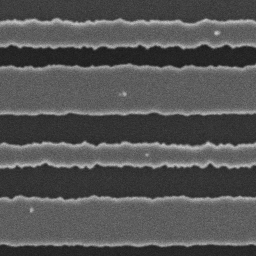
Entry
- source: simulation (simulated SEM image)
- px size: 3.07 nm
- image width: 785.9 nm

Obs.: lines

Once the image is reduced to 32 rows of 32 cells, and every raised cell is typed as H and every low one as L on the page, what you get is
LLLLLLLLLLLLLLLLLLLLLLLLLLLLLLLL
LLLLLLLLLLLLLLLLLLLLLLLLLLLLLLLL
LLLLHLLHLLLLLLLLLLLLLLLLLHLLLLLL
HHHHHHHHHHHHHHHHHHHHHHHHHHHHHHHH
HHHHHHHHHHHHHHHHHHHHHHHHHHHHHHHH
HHHHHHHHHHHHHHHHHHHHHHHHHHHHHHHH
LLLLLLLLLLLLLLLLLLLLLLLLLLLLLLLL
LLLLLLLLLLLLLLLLLLLLLLLLLLLLLLLL
HHHHHHHHHHHHHHHHHHHHHHHHHHHHHHHH
HHHHHHHHHHHHHHHHHHHHHHHHHHHHHHHH
HHHHHHHHHHHHHHHHHHHHHHHHHHHHHHHH
HHHHHHHHHHHHHHHHHHHHHHHHHHHHHHHH
HHHHHHHHHHHHHHHHHHHHHHHHHHHHHHHH
HHHHHHHHHHHHHHHHHHHHHHHHHHHHHHHH
LLLLLLLLLLLLLLLLLLLLLLLLLLLLLLLL
LLLLLLLLLLLLLLLLLLLLLLLLLLLLLLLL
LLLLLLLLLLLLLLLLLLLLLLLLLLLLLLLL
LLLLLLLLLLLLLLLLLLLLLLLLLLLLLLLL
HHHHHHHHHHHHHHHHHHHHHHHHHHHHHHHH
HHHHHHHHHHHHHHHHHHHHHHHHHHHHHHHH
HHHHHLHHHHHHHHHHHHHHHHHHHHHHHHHH
LLLLLLLLLLLLLLLLLLLLLLLLLLLLLLLL
LLLLLLLLLLLLLLLLLLLLLLLLLLLLLLLL
LLLLLLLLLLLLLLLLLLLLLLLLLLLLLLLL
LLHLLLLLLLLLLLLLLLLLLLLLLLLLLLLL
HHHHHHHHHHHHHHHHHHHHHHHHHHHHHHHH
HHHHHHHHHHHHHHHHHHHHHHHHHHHHHHHH
HHHHHHHHHHHHHHHHHHHHHHHHHHHHHHHH
HHHHHHHHHHHHHHHHHHHHHHHHHHHHHHHH
HHHHHHHHHHHHHHHHHHHHHHHHHHHHHHHH
HHHHHHHHHHHHHHHHHHHHHHHHHHHHHHHH
LLLLLLLLLLLLLLLLLLLLLLLLLLLLLLLL